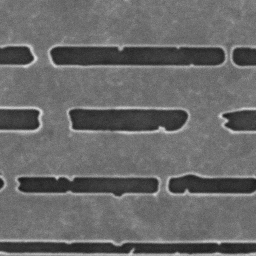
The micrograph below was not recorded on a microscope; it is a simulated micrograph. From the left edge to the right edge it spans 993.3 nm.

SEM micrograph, one or a few lines or trenches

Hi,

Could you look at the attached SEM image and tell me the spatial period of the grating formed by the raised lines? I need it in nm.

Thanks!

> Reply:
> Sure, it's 253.